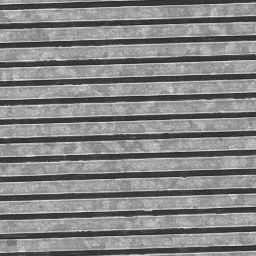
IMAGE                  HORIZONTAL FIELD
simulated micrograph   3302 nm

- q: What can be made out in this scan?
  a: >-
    parallel lines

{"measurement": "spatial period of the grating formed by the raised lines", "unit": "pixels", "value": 19.1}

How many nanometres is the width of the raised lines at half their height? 158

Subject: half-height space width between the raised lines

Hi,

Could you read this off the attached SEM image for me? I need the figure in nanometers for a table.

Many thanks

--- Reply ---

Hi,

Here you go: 83.8